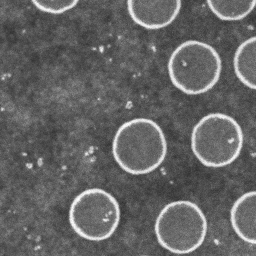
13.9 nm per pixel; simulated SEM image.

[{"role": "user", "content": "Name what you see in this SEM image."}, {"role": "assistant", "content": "raised bodies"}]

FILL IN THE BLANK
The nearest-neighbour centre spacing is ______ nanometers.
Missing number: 1080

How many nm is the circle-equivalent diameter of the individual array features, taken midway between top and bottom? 684